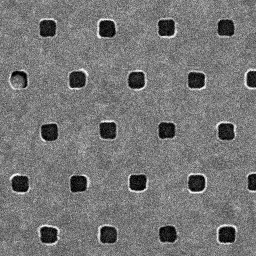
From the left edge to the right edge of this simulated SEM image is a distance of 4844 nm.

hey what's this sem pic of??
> a regular array of holes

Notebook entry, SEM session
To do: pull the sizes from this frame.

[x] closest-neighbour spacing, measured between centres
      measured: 1110 nanometers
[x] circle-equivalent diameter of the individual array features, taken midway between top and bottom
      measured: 18.6 pixels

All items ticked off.